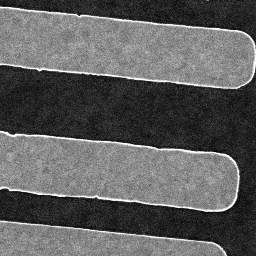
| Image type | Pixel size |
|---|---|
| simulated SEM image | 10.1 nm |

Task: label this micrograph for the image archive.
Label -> one or a few lines or trenches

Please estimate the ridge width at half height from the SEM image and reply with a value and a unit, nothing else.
581 nanometers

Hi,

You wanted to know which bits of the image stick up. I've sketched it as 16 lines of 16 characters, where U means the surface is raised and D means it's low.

UDDDDDDDDDDDDDDD
UUUUUUUUUUDDDDDD
UUUUUUUUUUUUUUUU
UUUUUUUUUUUUUUUU
DDDDUUUUUUUUUUUU
DDDDDDDDDDDDDDUD
DDDDDDDDDDDDDDDD
DDDDDDDDDDDDDDDD
UUUDDDDDDDDDDDDD
UUUUUUUUUUUUDDDD
UUUUUUUUUUUUUUUD
UUUUUUUUUUUUUUUD
DDDDDDDUUUUUUUUD
DDDDDDDDDDDDDDDD
UUUUUUUDDDDDDDDD
UUUUUUUUUUUUUUDD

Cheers